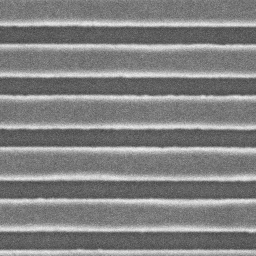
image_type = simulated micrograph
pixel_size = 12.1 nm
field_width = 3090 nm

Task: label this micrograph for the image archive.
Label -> lines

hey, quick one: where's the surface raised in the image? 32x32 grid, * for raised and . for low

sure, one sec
********************************
********************************
********************************
................................
................................
................................
********************************
********************************
********************************
********************************
................................
................................
********************************
********************************
********************************
********************************
................................
................................
******.*.**.....................
********************************
********************************
********************************
................................
................................
................................
********************************
********************************
********************************
********************************
................................
................................
********************************